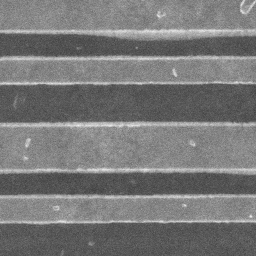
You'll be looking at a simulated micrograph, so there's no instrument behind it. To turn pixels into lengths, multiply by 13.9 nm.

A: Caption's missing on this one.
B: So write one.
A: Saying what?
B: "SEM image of lines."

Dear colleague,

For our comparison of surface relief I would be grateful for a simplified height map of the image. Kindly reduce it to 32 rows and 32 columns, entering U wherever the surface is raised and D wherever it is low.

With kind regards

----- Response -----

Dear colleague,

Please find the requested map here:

UUUUUUUUUUUUUUUUUUUUUUUUUUUUUUUU
UUUUUUUUUUUUUUUUUUUUUUUUUUUUUUUU
UUUUUUUUUUUUUUUUUUUUUUUUUUUUUUUU
UUUUUUUUUUUUUUUUUUUUUUUUUUUUUUUU
DDDDDDDDDDDDDDDDDDDDDDDDDDDDDDDD
DDDDDDDDDDDDDDDDDDDDDDDDDDDDDDDD
DDDDDDDDDDDDDDDDDDDDDDDDDDDDDDDD
UUUUUUUUUUUUUUUUUUUUUUUUUUUUUUUU
UUUUUUUUUUUUUUUUUUUUUUUUUUUUUUUU
UUUUUUUUUUUUUUUUUUUUUUUUUUUUUUUU
DDDDDDDDDDDDDDDDDDDDDDDDDDDDDDDD
DDDDDDDDDDDDDDDDDDDDDDDDDDDDDDDD
DDDDDDDDDDDDDDDDDDDDDDDDDDDDDDDD
DDDDDDDDDDDDDDDDDDDDDDDDDDDDDDDD
DDDDDDDDDDDDDDDDDDDDDDDDDDDDDDDD
DDDDDDDDDDDDDDDDDDDDDDDDDDDDDDDD
UUUUUUUUUUUUUUUUUUUUUUUUUUUUUUUU
UUUUUUUUUUUUUUUUUUUUUUUUUUUUUUUU
UUUUUUUUUUUUUUUUUUUUUUUUUUUUUUUU
UUUUUUUUUUUUUUUUUUUUUUUUUUUUUUUU
UUUUUUUUUUUUUUUUUUUUUUUUUUUUUUUU
DDDDDDDDDDDDDDDDDDDDDDDDDDDDDDDD
DDDDDDDDDDDDDDDDDDDDDDDDDDDDDDDD
DDDDDDDDDDDDDDDDDDDDDDDDDDDDDDDD
DDDDDDDDDDDDDDDDDDDUUUUUUUUUUUUU
UUUUUUUUUUUUUUUUUUUUUUUUUUUUUUUU
UUUUUUUUUUUUUUUUUUUUUUUUUUUUUUUU
UUUUUUUUUUUUUUUUUUUUUUUUUUUUUUUU
DDDDDDDDDDDDDDDDDDDDDDDDDDDDDDDD
DDDDDDDDDDDDDDDDDDDDDDDDDDDDDDDD
DDDDDDDDDDDDDDDDDDDDDDDDDDDDDDDD
DDDDDDDDDDDDDDDDDDDDDDDDDDDDDDDD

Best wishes